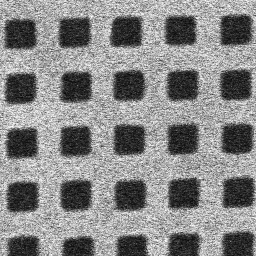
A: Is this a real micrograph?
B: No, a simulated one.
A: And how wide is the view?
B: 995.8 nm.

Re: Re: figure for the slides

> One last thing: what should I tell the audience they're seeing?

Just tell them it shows a regular array of holes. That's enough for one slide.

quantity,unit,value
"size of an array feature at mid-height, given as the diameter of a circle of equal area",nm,133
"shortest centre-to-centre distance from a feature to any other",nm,208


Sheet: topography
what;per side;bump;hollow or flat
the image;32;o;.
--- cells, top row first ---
oooooooooooooooooooooooooooooooo
oooooooooooooooooooooooooooooooo
o...oooo...ooo....ooo...oooo...o
o...ooo....ooo....ooo....oo....o
o....oo....ooo....ooo....oo....o
o....oo....ooo....ooo...oooo...o
oooooooooooooooooooooooooooooooo
oooooooooooooooooooooooooooooooo
oooooooooooooooooooooooooooooooo
o...oooo...ooo....ooo....ooo...o
o....ooo...ooo....ooo....oo....o
o....ooo...ooo....ooo....oo....o
o...oooo...ooo....ooo...oooo...o
oooooooooooooooooooooooooooooooo
oooooooooooooooooooooooooooooooo
oooooooooooooooooooooo..oooo...o
o....ooo...ooo....ooo....ooo....
o....oo....ooo....ooo....ooo....
o....oo....ooo....ooo....ooo....
o...oooo...ooooooooooooooooooooo
oooooooooooooooooooooooooooooooo
oooooooooooooooooooooooooooooooo
ooooooooo..oooo..oooo....ooo....
o....oo....ooo....ooo....ooo....
o....oo....ooo....ooo....ooo....
o....ooo...ooo....ooo....ooo....
oo..oooooooooooooooooooooooooooo
oooooooooooooooooooooooooooooooo
oooooooooooooooooooooooooooooooo
ooo.ooooooooooo...ooo....ooo....
o....ooo....oo....ooo....ooo....
o....ooo....oo....ooo....ooo....